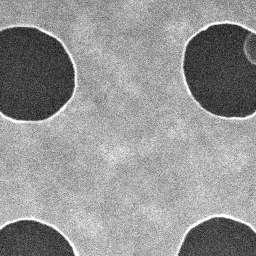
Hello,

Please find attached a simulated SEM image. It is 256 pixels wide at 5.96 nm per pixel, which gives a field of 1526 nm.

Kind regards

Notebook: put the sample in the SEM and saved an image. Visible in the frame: holes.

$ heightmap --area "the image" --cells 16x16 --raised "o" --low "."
oooooooooooooooo
oooooooooooooo.o
....oooooooo....
....oooooooo....
.....oooooo.....
.....ooooooo....
....oooooooo....
o..ooooooooooooo
oooooooooooooooo
oooooooooooooooo
oooooooooooooooo
oooooooooooooooo
oooooooooooooooo
oooooooooooooooo
....oooooooo....
.....oooooo.....